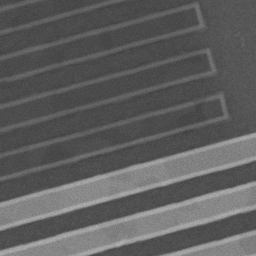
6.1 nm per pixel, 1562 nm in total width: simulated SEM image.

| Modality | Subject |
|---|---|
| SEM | parallel lines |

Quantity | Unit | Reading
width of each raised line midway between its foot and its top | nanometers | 139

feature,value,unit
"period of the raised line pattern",286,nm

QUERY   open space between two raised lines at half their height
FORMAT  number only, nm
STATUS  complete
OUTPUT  150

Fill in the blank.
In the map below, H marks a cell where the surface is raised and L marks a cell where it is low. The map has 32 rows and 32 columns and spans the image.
LLLHHHHHHHHHHLLLLLLLLLLLLLLLLLLL
HHHHHHHHHHLLLLLLLLLLLHHHHLLLLLLL
HHHHHHLLLLLLLLLLLLHHHHHHHLLLLLLL
HHLLLLLLLLLLLLHHHHHHHHHHLLLLLLLL
LLLLLLLLLLHHHHHHHHHHHLLLLLLLLLLL
LLLLLLLHHHHHHHHHHLLLLLLLLLLLLLLL
LLLHHHHHHHHHHLLLLLLLLLLLLHLLLLLL
HHHHHHHHHHLLLLLLLLLLLHHHHHLLLLLL
HHHHHHLLLLLLLLLLLLHHHHHHHHHLLLLL
HHHLLLLLLLLLLLHHHHHHHHHHHLLLLLLL
LLLLLLLLLLLHHHHHHHHHHLLLLLLLLLLL
LLLLLLLHHHHHHHHHHHLLLLLLLLLLLLLL
LLLHHHHHHHHHHHLLLLLLLLLLLLHHLLLL
HHHHHHHHHHLLLLLLLLLLLLHHHHHHLLLL
HHHHHHHLLLLLLLLLLLHHHHHHHHHHLLLL
HHHLLLLLLLLLLLLHHHHHHHHHHLLLLLLL
LLLLLLLLLLLHHHHHHHHHHHLLLLLLLLLL
LLLLLLLHHHHHHHHHHHLLLLLLLLLLLHHH
LLLLHHHHHHHHHHLLLLLLLLLLLLHHHHHH
HHHHHHHHHHHLLLLLLLLLLLHHHHHHHHHH
HHHHHHHLLLLLLLLLLLHHHHHHHHHHHHLL
HHHLLLLLLLLLLLLHHHHHHHHHHHLLLLLL
LLLLLLLLLLLHHHHHHHHHHHLLLLLLLLLL
LLLLLLLLHHHHHHHHHHLLLLLLLLLLLLHH
LLLLHHHHHHHHHHHLLLLLLLLLLLHHHHHH
LHHHHHHHHHHLLLLLLLLLLLLHHHHHHHHH
HHHHHHHHLLLLLLLLLLLHHHHHHHHHHHLL
HHHHLLLLLLLLLLLHHHHHHHHHHHLLLLLL
LLLLLLLLLLLLHHHHHHHHHHLLLLLLLLLL
LLLLLLLLHHHHHHHHHHHLLLLLLLLLLLHH
LLLLHHHHHHHHHHHLLLLLLLLLLLLHHHHH
LHHHHHHHHHHLLLLLLLLLLLLHHHHHHHHH